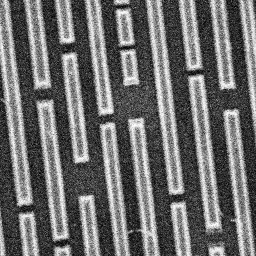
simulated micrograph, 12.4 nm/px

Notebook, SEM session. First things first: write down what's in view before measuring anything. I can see parallel lines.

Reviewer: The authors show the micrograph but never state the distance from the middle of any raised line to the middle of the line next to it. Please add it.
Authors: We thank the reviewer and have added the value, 0.379 micrometres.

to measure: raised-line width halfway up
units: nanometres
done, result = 146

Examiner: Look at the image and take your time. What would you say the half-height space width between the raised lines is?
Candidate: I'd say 231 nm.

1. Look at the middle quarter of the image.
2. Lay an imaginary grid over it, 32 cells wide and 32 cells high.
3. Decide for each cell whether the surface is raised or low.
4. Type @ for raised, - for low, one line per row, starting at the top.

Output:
@@@-----@@-----@@@-----@@@-----@
@@@-----@@-----@@@-----@@@------
@@@-----@@@----@@@-----@@@------
-@@-----@@@----@@@-----@@@------
-@@-----@@@-------------@@------
-@@@----@@@-------------@@------
-@@@-----@@-------------@@------
-@@@-----@@-------------@@@-----
-@@@-----@@-------------@@@-----
-@@@-----@@-------------@@@-----
-@@@-----@@@------------@@@-----
-@@@-----@@@------------@@@-----
--@@--------------------@@@-----
--@@@-------------------@@@-----
--@@@--------------------@@-----
--@@@-----@@-----@@@-----@@-----
--@@@-----@@-----@@@-----@@@----
--@@@-----@@-----@@@-----@@@----
--@@@-----@@@----@@@-----@@@----
--@@@-----@@@----@@@-----@@@----
---@@-----@@@----@@@-----@@@----
---@@-----@@@----@@@-----@@@----
---@@@----@@@-----@@------@@----
---@@@-----@@-----@@@-----@@----
-----------@@-----@@@-----@@@---
-----------@@-----@@@-----@@@---
-----------@@-----@@@-----@@@---
-----------@@@----@@@-----@@@---
-----------@@@----@@@-----@@@---
-----------@@@----@@@------@@---
-----------@@@-----@@-----@@@---
------------@@-----@@------@@---